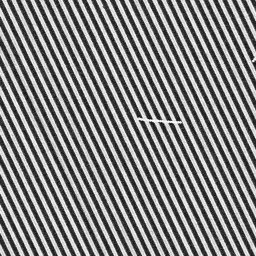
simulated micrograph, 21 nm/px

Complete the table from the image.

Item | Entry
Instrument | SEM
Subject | parallel lines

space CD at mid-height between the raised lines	121	nm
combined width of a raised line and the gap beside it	178	nanometres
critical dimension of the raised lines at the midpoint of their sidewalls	61.7	nanometres